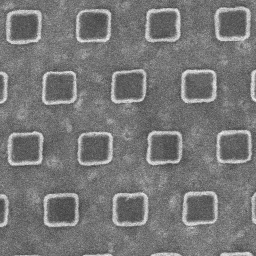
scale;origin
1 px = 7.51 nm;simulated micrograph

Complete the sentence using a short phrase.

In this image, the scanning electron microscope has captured a regular array of raised bodies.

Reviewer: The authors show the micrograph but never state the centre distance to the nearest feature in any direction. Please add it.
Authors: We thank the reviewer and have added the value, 0.522 um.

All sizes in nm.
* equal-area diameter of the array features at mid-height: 257